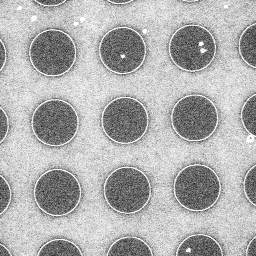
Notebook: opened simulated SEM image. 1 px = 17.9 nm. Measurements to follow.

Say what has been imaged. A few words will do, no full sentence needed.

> an array of small figures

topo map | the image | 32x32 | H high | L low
LLLLLHHLLLLLLLLLLLLLLLLLLLLLLLLL
LLLLLLLLLLLLLLLLLLLLLLLLLLLLLLLL
LLLLLLLLLLLLLLLLLLLLLLLLLLLLLLLL
LLLLLLLLLLLLLLLHLLLLLLLHHLLLLLLH
LLLLLHHHHLLLLHHHHHLLLLHHHHLLLLHH
LLLLHHHHHLLLLHHHHHLLLHHHHHHLLLHH
HLLLHHHHHLLLHHHHHHLLLHHHHHHLLLHH
HLLLHHHHHLLLLHHHHHLLLLHHHHHLLLLH
LLLLHHHHHLLLLHHHHLLLLLLHHLLLLLLL
LLLLLLLLLLLLLLLLLLLLLLLLLLLLLLLL
LLLLLLLLLLLLLLLLLLLLLLLLLLLLLLLL
LLLLLLLLLLLLLLLLLLLLLLLLLLLLLLLL
LLLLLLLLLLLLLLHHHLLLLLLHHHLLLLLH
LLLLLHHHHLLLLHHHHHLLLLHHHHHLLLHH
HLLLHHHHHHLLLHHHHHLLLHHHHHHLLLHH
HLLLHHHHHHLLLHHHHHLLLLHHHHHLLLHH
HLLLHHHHHHLLLHHHHHLLLLHHHHHLLLLH
LLLLLHHHHLLLLLHHHLLLLLLHHLLLLLLL
LLLLLLLLLLLLLLLLLLLLLLLLLLLLLLLL
LLLLLLLLLLLLLLLLLLLLLLLLLLLLLLLL
LLLLLLLLLLLLLLLLLLLLLLLLLLLLLLLL
LLLLLLHHLLLLLLHHHHLLLLLHHHHLLLLH
HLLLLHHHHHLLLHHHHHLLLLHHHHHLLLLH
HLLLHHHHHHLLLHHHHHHLLLHHHHHHLLLH
HLLLHHHHHHLLLHHHHHHLLLHHHHHLLLLH
HLLLLHHHHHLLLLHHHHLLLLLHHHHLLLLL
LLLLLLHHHLLLLLLHHLLLLLLLLLLLLLLL
LLLLLLLLLLLLLLLLLLLLLLLLLLLLLLLL
LLLLLLLLLLLLLLLLLLLLLLLLLLLLLLLL
LLLLLLLLLLLLLLLLLLLLLLLLHHLLLLLL
LLLLLLHHHLLLLLHHHHLLLLLHHHHLLLLH
HLLLLHHHHHLLLLHHHHHLLLHHHHHHLLLH